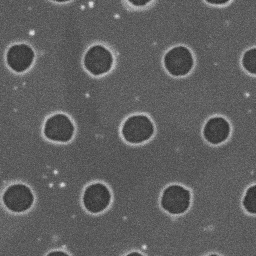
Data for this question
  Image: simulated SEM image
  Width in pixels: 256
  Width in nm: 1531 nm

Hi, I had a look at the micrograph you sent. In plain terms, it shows a regular array of holes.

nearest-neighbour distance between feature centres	469	nm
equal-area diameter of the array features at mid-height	176	nanometres